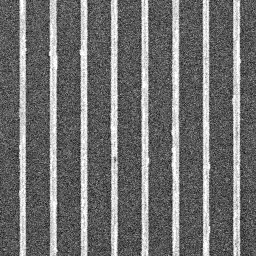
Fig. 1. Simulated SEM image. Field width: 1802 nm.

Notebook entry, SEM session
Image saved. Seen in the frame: parallel lines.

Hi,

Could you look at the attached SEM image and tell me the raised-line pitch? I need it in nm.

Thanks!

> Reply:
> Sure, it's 215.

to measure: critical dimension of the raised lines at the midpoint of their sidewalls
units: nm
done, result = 44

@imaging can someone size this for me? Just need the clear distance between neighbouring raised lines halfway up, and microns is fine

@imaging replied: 0.172